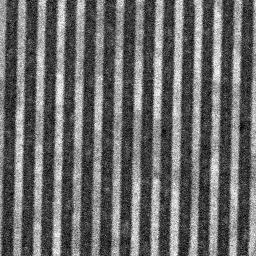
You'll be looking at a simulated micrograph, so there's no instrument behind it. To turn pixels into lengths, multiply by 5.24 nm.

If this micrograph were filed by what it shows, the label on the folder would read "parallel lines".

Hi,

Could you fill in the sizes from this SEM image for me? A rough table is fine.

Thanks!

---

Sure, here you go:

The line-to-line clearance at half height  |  67.4 nm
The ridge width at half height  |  36 nm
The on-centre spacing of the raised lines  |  19.6 pixels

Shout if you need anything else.